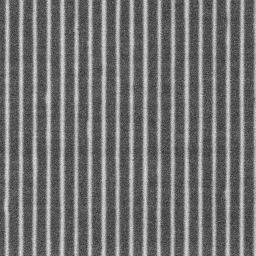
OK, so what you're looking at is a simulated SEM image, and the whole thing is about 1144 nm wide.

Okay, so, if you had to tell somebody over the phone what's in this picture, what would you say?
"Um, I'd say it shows parallel lines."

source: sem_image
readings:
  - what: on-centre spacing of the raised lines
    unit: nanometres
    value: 61.8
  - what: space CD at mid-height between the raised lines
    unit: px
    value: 10.7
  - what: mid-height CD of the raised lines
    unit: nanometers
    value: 15.6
